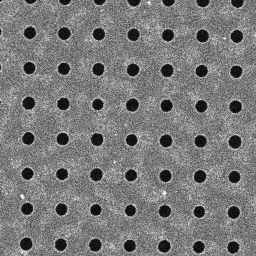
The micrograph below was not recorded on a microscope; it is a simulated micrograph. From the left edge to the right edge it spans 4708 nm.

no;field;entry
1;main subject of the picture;a regular array of holes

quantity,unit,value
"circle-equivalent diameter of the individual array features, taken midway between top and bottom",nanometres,230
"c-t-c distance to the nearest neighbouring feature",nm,632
